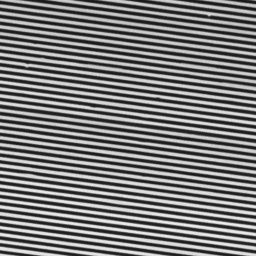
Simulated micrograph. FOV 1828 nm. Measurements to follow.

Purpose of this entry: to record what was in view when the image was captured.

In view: parallel lines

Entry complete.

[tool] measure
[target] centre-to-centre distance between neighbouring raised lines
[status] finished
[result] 6.86 pixels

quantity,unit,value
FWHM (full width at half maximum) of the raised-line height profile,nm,27.4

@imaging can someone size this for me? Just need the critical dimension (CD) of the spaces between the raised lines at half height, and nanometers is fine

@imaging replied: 21.2